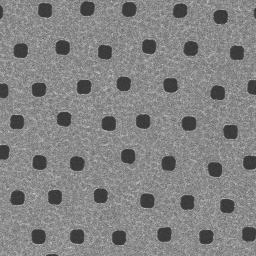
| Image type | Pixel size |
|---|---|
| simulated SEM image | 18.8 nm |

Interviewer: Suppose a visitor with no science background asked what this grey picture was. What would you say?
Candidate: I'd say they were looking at a regular array of holes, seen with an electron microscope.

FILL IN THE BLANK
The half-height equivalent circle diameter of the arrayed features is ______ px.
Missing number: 14.9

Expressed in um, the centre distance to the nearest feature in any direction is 0.73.